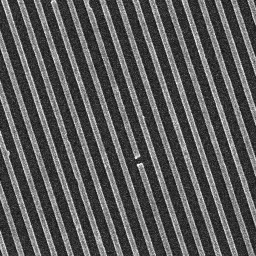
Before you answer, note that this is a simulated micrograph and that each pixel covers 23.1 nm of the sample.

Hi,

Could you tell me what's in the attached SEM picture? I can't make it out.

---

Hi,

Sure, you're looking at parallel lines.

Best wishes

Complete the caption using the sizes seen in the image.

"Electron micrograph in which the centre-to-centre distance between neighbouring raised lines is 360 nanometres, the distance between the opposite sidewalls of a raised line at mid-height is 5.35 px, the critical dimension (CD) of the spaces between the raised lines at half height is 244 nm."